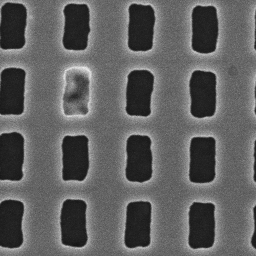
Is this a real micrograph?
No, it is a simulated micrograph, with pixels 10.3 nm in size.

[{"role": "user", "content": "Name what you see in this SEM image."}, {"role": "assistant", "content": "a regular array of holes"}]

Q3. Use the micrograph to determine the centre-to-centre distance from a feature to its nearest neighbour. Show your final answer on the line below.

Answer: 63.6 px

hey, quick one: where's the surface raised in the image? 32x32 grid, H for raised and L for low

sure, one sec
HLLHHHHHLLHHHHHHHHHHHHHHHHHHHHHH
LLLHHHHHLLLHHHHHLLLHHHHHLLLHHHHH
LLLHHHHHLLLHHHHHLLLHHHHHLLLHHHHH
LLLHHHHHLLLHHHHHLLLHHHHHLLLHHHHH
LLLHHHHHLLLHHHHHLLLHHHHHLLLHHHHH
LLLHHHHHLLLHHHHHLLLHHHHHLLLHHHHH
HHHHHHHHHHHHHHHHHHHHHHHHHLLHHHHH
HHHHHHHHHHHHHHHHHHHHHHHHHHHHHHHH
HLHHHHHHHHHHHHHHHHHHHHHHHHHHHHHH
LLLHHHHHHHHHHHHHLLLHHHHHLLLHHHHH
LLLHHHHHHHHHHHHHLLLHHHHHLLLHHHHH
LLLHHHHHHHHHHHHHLLLHHHHHLLLHHHHH
LLLHHHHHHHHHHHHHLLLHHHHHLLLHHHHH
LLLHHHHHHHHHHHHHLLLHHHHHLLLHHHHH
HHHHHHHHHHHHHHHHHLHHHHHHLLHHHHHH
HHHHHHHHHHHHHHHHHHHHHHHHHHHHHHHH
HHHHHHHHHHHHHHHHHHHHHHHHHHHHHHHH
LLLHHHHHLLLHHHHHLLLHHHHHLLLHHHHH
LLLHHHHHLLLHHHHHLLLHHHHHLLLHHHHH
LLLHHHHHLLLHHHHHLLLHHHHHLLLHHHHH
LLLHHHHHLLLHHHHHLLLHHHHHLLLHHHHH
LLLHHHHHLLLHHHHHLLLHHHHHLLLHHHHH
LLHHHHHHLLHHHHHHLLLHHHHHLLLHHHHH
HHHHHHHHHHHHHHHHHHHHHHHHHHHHHHHH
HHHHHHHHHHHHHHHHHHHHHHHHHHHHHHHH
LLLHHHHHLLLHHHHHLLLHHHHHLLLHHHHH
LLLHHHHHLLLHHHHHLLLHHHHHLLLHHHHH
LLLHHHHHLLLHHHHHLLLHHHHHLLLHHHHH
LLLHHHHHLLLHHHHHLLLHHHHHLLLHHHHH
LLLHHHHHLLLHHHHHLLLHHHHHLLLHHHHH
LLLHHHHHLLLHHHHHLLLHHHHHLLLHHHHL
HHHHHHHHHHHHHHHHHHHHHHHHHHHHHHHH